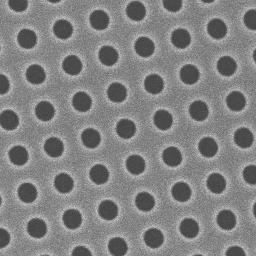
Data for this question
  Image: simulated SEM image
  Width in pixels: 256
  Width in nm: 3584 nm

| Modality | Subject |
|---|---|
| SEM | a regular array of holes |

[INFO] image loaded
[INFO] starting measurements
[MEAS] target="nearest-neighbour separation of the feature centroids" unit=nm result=516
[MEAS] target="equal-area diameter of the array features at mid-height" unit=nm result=290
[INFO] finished